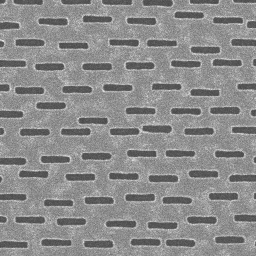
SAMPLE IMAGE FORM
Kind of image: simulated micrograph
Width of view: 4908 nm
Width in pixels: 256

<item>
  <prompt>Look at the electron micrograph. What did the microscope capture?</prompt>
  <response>a regular array of holes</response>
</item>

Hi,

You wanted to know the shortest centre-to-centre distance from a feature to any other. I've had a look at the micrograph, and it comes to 518 nanometres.